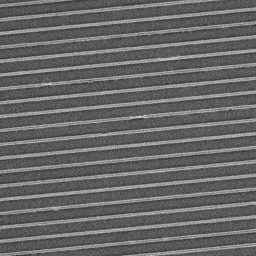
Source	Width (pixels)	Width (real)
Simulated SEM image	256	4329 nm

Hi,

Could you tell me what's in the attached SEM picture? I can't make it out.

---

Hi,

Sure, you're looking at parallel lines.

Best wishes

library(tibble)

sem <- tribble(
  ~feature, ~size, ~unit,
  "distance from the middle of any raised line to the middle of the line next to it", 233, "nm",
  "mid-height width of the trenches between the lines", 11.7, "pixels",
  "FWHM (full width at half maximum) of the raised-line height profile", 40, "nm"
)